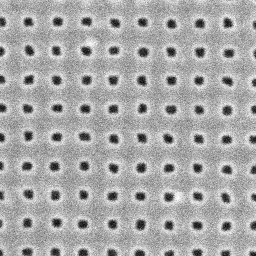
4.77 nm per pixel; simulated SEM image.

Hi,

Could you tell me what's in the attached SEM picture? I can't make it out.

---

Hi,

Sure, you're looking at a regular array of holes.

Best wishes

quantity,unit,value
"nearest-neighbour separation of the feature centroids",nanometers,132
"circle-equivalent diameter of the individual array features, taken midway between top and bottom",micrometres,0.0519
